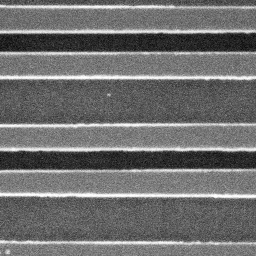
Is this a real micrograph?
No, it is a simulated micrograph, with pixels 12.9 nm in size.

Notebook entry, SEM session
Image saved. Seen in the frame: lines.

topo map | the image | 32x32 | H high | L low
LLLLLLLLLLLLLLLLLLLLLLLLLLLLLLLL
HHHHHHHHHHHHHHHHHHHHHHHHHHHHHHHH
HHHHHHHHHHHHHHHHHHHHHHHHHHHHHHHH
HHHHHHHHHHHHHHHHHHHHHHHHHHHHHHHH
LLLLLLLLLLLLLLLLLLLLLLLLLLLLLLLL
LLLLLLLLLLLLLLLLLLLLLLLLLLLLLLLL
LLLLLLLLLLLLLLLLLLLLLLLLLLLLLLLL
HHHHHHHHHHHHHHHHHHHHHHHHHHHHHHHH
HHHHHHHHHHHHHHHHHHHHHHHHHHHHHHHH
HHHHHHHHHHHHHHHHHHHHHHHHHHHHHHHH
LLLLLLLLLLLLLLLLLLLLLLLLLLLLLLLL
LLLLLLLLLLLLLLLLLLLLLLLLLLLLLLLL
LLLLLLLLLLLLLLLLLLLLLLLLLLLLLLLL
LLLLLLLLLLLLLLLLLLLLLLLLLLLLLLLL
LLLLLLLLLLLLLLLLLLLLLLLLLLLLLLLL
LLLLLLLLLLLLLLLLLLLLLLLLLLLLLLLL
HHHHHHHHHHHHHHHHHHHHHHHHHHHHHHHH
HHHHHHHHHHHHHHHHHHHHHHHHHHHHHHHH
HHHHHHHHHHHHHHHHHHHHHHHHHHHHHHHH
LLLLLLLLLLLLLLLLLLLLLLLLLLLLLLLL
LLLLLLLLLLLLLLLLLLLLLLLLLLLLLLLL
HHHHHHHHHHHHHHHHHHHHHHHHHHHHHHHH
HHHHHHHHHHHHHHHHHHHHHHHHHHHHHHHH
HHHHHHHHHHHHHHHHHHHHHHHHHHHHHHHH
LLLLLLLLLHHHHHHHHHHHHHHHHHHHHHHH
LLLLLLLLLLLLLLLLLLLLLLLLLLLLLLLL
LLLLLLLLLLLLLLLLLLLLLLLLLLLLLLLL
LLLLLLLLLLLLLLLLLLLLLLLLLLLLLLLL
LLLLLLLLLLLLLLLLLLLLLLLLLLLLLLLL
LLLLLLLLLLLLLLLLLLLLLLLLLLLLLLLL
HHHHHHHHHHHHHHHHHHHHHHHHHHHHHHHH
HHHHHHHHHHHHHHHHHHHHHHHHHHHHHHHH